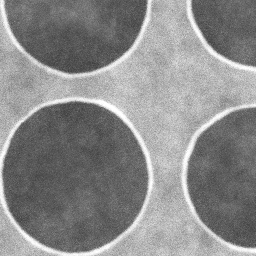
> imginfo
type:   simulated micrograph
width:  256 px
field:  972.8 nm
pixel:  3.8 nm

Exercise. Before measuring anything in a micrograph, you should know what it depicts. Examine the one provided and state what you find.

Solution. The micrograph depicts holes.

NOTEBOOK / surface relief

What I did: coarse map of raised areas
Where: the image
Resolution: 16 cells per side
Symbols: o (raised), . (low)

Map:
.........ooo....
.........ooo....
o........oooo...
oo......oooooo..
oooo..oooooooooo
oooooooooooooooo
ooo...oooooooooo
oo......oooooo..
o........ooo....
.........ooo....
.........ooo....
.........ooo....
.........ooo....
o........ooo....
oo......ooooo...
ooo...ooooooooo.